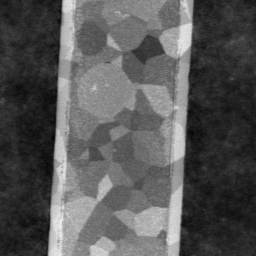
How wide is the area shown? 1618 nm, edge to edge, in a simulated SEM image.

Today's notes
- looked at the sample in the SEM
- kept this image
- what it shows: one or a few lines or trenches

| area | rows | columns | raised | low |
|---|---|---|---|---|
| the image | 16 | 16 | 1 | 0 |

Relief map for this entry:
0000111111110000
0000111111110000
0000111111100000
0000111111100000
0000111111100000
0000111111100000
0000111111100000
0000111111100000
0000111111100000
0000111111100000
0000111111100000
0000111111100000
0000111111100000
0000111111100000
0001111111100000
0001111111100000